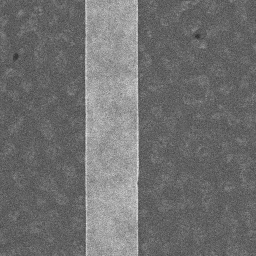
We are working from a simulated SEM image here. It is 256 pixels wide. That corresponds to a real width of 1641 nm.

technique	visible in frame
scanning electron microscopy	one or a few lines or trenches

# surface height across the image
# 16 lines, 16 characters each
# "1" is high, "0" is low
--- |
0000011110000000
0000011110000000
0000011110000000
0000011110000000
0000011110000000
0000011110000000
0000011110000000
0000011110000000
0000011110000000
0000011110000000
0000011110000000
0000011110000000
0000011110000000
0000011110000000
0000011110000000
0000011110000000